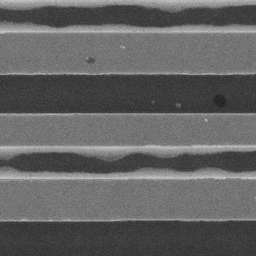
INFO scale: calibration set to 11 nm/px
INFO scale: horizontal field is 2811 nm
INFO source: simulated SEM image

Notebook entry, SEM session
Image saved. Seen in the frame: lines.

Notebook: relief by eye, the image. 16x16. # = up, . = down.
................
................
################
################
################
................
................
################
################
................
................
################
################
################
................
................